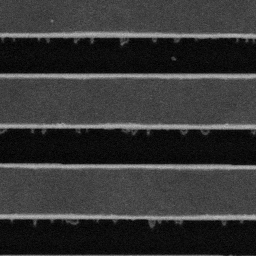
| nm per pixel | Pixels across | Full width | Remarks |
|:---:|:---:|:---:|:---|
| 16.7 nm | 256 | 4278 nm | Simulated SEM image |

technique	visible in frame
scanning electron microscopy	lines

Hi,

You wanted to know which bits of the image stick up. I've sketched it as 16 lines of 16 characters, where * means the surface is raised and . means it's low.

****************
****************
................
................
................
****************
****************
****************
................
................
****************
****************
****************
****************
................
................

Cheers